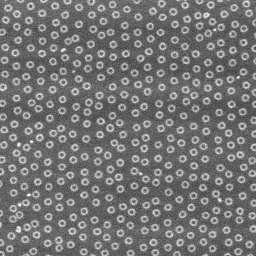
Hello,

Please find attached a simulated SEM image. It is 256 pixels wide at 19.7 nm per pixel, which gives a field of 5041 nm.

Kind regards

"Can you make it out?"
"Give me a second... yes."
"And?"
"a regular array of raised bodies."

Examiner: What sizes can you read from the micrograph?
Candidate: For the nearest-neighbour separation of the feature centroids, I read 228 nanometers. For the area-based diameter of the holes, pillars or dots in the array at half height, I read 0.116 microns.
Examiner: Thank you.